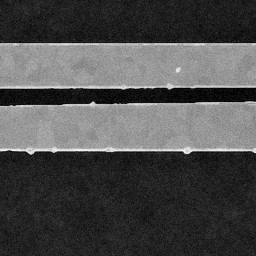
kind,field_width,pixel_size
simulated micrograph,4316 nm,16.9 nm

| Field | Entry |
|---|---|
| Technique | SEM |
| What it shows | lines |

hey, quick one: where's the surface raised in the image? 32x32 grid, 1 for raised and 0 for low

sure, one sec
00000000000000000000000000000000
00000000000000000000000000000000
00000000000000000000000000000000
00000000000000000000000000000000
00000000000000000000000000000000
00000000000000000000000000000000
11111111111111111111111111111111
11111111111111111111111111111111
11111111111111111111111111111111
11111111111111111111111111111111
11111111111111111111111111111111
00000000000000000000000000000000
00000000000000000000000000000000
11111111111111111111111111111111
11111111111111111111111111111111
11111111111111111111111111111111
11111111111111111111111111111111
11111111111111111111111111111111
11111111111111111111111111111111
00000000000000000000000000000000
00000000000000000000000000000000
00000000000000000000000000000000
00000000000000000000000000000000
00000000000000000000000000000000
00000000000000000000000000000000
00000000000000000000000000000000
00000000000000000000000000000000
00000000000000000000000000000000
00000000000000000000000000000000
00000000000000000000000000000000
00000000000000000000000000000000
00000000000000000000000000000000